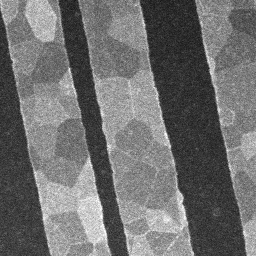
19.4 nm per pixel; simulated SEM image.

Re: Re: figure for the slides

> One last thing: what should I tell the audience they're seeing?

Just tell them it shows one or a few lines or trenches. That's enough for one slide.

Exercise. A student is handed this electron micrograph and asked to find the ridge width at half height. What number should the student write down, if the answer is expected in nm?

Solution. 1130